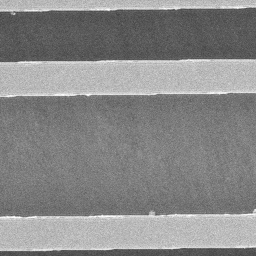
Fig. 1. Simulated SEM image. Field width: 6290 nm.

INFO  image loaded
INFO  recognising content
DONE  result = lines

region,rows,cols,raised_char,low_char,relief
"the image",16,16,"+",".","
++++++++++++....
................
................
................
++++++++++++++++
++++++++++++++++
................
................
................
................
................
................
................
..........++++++
++++++++++++++++
++++++++++++....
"